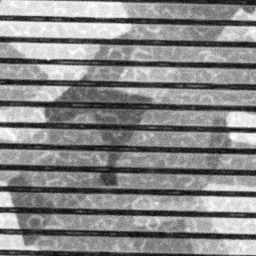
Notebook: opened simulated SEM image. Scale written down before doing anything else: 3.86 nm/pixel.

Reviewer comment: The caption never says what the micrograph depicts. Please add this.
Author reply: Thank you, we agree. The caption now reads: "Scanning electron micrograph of parallel lines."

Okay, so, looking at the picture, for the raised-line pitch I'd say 82.2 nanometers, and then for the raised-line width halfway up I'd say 0.0559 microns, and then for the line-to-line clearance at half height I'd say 6.37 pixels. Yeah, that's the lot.